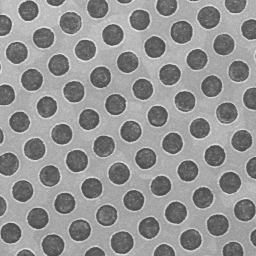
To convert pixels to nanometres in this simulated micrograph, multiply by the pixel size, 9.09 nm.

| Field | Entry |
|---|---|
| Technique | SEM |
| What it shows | a regular array of holes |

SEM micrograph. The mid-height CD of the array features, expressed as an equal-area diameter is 21.9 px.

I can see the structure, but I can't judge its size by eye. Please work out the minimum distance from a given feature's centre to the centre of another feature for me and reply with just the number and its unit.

279 nm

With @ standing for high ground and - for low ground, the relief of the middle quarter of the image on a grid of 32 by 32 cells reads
-@@@@@@@@@@@@------@@@@@@---@@@-
-@@@@@@----@@@----@@@@@@-----@@@
@@@@@@@-----@@@@@@@@@@@@-----@@@
@@@@@@------@@@@@@@-@@@@-----@@@
@---@@@-----@@@@@@----@@----@@@@
-----@@----@@@@@@-----@@@@-@@@@@
-----@@@@@@@@@@@@-----@@@@@@@@@@
-----@@@@@@@--@@@-----@@@@@@----
-----@@@@@@----@@@---@@@@@@@----
@---@@@@@@------@@@@@@@@@@@-----
@@@@@@@@@@------@@@@@@--@@@@----
@@@@@---@@@----@@@@@@-----@@@---
@@@@-----@@---@@@@@@@-----@@@@@@
@@@@-----@@@@@@@@@@@@-----@@@@@@
@@@@-----@@@@@@---@@@-----@@@@@@
-@@@----@@@@@@-----@@@---@@@@@@-
--@@@--@@@@@@@-----@@@@@@@@@@@@-
--@@@@@@@@@@@@-----@@@@@@@---@@@
--@@@@@@----@@-----@@@@@@-----@@
-@@@@@@------@@@--@@@@@@------@@
@@@@@@@------@@@@@@@@@@@@-----@@
@@--@@@------@@@@@@---@@@----@@@
@-----@@----@@@@@@-----@@@--@@@@
------@@@@@@@@@@@@-----@@@@@@@@@
------@@@@@@@-@@@@-----@@@@@@@--
@-----@@@@@@----@@@---@@@@@@@---
@@---@@@@@@------@@@@@@@@@@@----
@@@@@@@@@@@------@@@@@@@@@@@----
@@@@@@--@@@-----@@@@@@@---@@@---
@@@@@----@@@----@@@@@@-----@@@@-
@@@@------@@@@@@@@@@@------@@@@@
@@@@------@@@@@@@-@@@@-----@@@@@